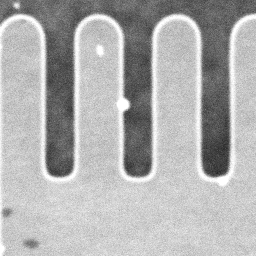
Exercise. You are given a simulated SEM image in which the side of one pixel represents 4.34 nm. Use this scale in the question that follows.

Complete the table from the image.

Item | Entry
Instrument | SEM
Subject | groups of lines, slits or small figures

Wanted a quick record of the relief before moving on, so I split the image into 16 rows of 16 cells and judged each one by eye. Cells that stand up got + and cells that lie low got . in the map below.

................
++...++...++...+
+++..+++..++..++
+++..+++..++..++
+++..+++..++..++
+++..+++..++..++
+++..+++..++..++
+++..+++..++..++
+++..+++..++...+
+++..+++..++..++
+++..+++..+++.++
++++++++++++++++
++++++++++++++++
++++++++++++++++
++++++++++++++++
++++++++++++++++